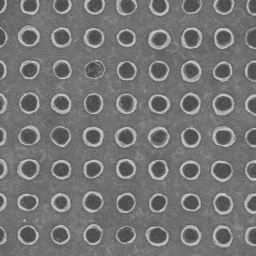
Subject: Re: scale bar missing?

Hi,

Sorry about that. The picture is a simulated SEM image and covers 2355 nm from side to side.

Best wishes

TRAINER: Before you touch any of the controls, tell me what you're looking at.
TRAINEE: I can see a regular array of raised bodies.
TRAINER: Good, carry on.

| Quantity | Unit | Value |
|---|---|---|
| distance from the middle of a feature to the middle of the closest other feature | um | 0.293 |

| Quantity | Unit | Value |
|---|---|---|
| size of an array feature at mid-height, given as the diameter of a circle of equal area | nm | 173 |